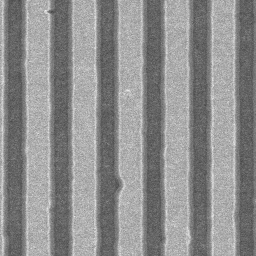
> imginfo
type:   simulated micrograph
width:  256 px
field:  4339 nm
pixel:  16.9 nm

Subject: parallel lines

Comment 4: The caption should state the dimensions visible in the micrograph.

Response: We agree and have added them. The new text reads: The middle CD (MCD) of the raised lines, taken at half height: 445 nanometers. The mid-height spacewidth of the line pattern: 341 nm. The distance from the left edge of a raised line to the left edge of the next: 785 nm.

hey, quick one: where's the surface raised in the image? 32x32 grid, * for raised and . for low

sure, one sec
*..***...***...***..****..***...
*..***...***...***..****..***...
*..***...***...***..****..***...
*..***...***...***..****..***...
*..***...***...***...***..***...
*..***...***...***..****..***...
*..***...***...***...***..***...
*..***...***...***...***..***...
*..***...***...***..****..***...
*..***...***...***..****..***...
*..***...***...***..****..***...
*..***...***...***..****..***...
*..***...***...***..****..***...
*..***...***...***...***..****..
*..***...***...***...***..***...
*..***...***...***..****..****..
*..***...***...***..****..****..
*..***...***...***..****..****..
*..***...***...***..****..****..
*..***...***...***..****..***...
*..***...***...***..****..****..
*..***...***...***..****..***...
*..***...***...***..****..****..
*..***...***...***..****..****..
*..***...***...***..****..****..
*..***...***...***...***..****..
*..***...***...***...***..***...
*..***...***...***..****..***...
*..***...***...***..****..***...
*..***...***...***..****..****..
*..***...***...***..****..****..
*..***...***...***..****..****..